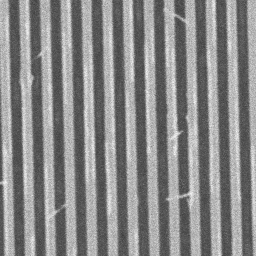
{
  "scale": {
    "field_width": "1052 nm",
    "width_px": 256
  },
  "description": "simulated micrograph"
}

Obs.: parallel lines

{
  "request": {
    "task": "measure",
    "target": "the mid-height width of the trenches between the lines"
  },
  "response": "45.2 nm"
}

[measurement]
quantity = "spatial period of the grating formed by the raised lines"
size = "85 nanometres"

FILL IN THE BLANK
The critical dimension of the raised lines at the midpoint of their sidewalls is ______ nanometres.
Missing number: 41.1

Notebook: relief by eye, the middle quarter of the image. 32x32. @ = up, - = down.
@@---@@---@@---@@---@@@---@@---@
@@---@@---@@---@@---@@@---@@---@
@@---@@---@@---@@---@@@---@@---@
@@---@@---@@---@@---@@@---@@---@
@@---@@---@@---@@---@@@---@@---@
@@---@@---@@---@@---@@@---@@---@
@@---@@---@@@--@@@--@@@---@@---@
@@---@@---@@@--@@@---@@---@@---@
@@---@@---@@@--@@@---@@---@@---@
@@---@@---@@@---@@---@@---@@---@
@@---@@---@@@---@@---@@---@@---@
@@---@@---@@@---@@---@@---@@---@
@@---@@---@@@---@@---@@---@@---@
@@---@@---@@@---@@---@@---@@---@
@@---@@---@@@---@@---@@---@@---@
@@---@@---@@@---@@---@@---@@---@
@@---@@---@@@---@@---@@---@@---@
@@---@@@--@@@---@@---@@---@@@--@
@@---@@@--@@@---@@---@@---@@---@
@@---@@@--@@@---@@---@@---@@---@
@@---@@@--@@@---@@---@@---@@---@
@@---@@@--@@@---@@---@@---@@---@
@@---@@@--@@@---@@---@@---@@---@
@@---@@@--@@@---@@---@@---@@---@
@@---@@@--@@@---@@---@@---@@---@
@@---@@@--@@@---@@---@@---@@---@
@@---@@@--@@@---@@---@@---@@---@
@@---@@@---@@---@@---@@---@@---@
@@@--@@@---@@---@@---@@---@@@---
-@@---@@---@@---@@---@@---@@@---
-@@---@@---@@---@@---@@---@@@--@
-@@---@@---@@---@@---@@---@@@---